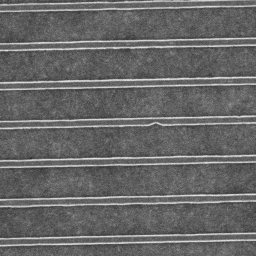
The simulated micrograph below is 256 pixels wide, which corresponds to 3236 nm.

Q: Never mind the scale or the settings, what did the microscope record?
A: parallel lines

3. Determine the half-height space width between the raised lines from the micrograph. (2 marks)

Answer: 408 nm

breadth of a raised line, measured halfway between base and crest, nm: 90.1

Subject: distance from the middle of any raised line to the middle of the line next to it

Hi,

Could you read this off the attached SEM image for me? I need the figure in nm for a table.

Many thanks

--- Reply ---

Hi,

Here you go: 493